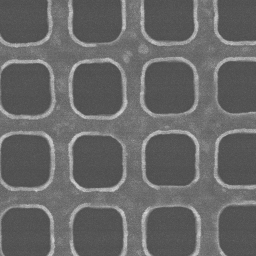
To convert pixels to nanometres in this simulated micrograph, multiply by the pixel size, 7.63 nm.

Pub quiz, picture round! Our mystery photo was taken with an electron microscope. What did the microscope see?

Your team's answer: holes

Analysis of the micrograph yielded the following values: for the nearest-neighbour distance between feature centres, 0.55 um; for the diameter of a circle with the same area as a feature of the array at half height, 0.425 um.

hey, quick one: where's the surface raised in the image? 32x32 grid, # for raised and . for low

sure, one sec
......###......###......###.....
......###......###......###.....
......###......###......###.....
......###......###......###.....
......###......####.....####....
################################
################################
################################
#.....####.....###......###.....
......###......###......###.....
......###......###......###.....
......###......###......###.....
......###......###......###.....
......###......###......####....
#############.##################
################################
################################
#.....###......####.....####....
......###......###......###.....
......###......###......###.....
......###......###.......##.....
......###......###.......##.....
......###......####.....####....
###.#######..###################
################################
################################
#.....####.....####.....####....
......###......###.......##.....
......###......###.......##.....
......###......###.......##.....
......###......###.......##.....
......####.....####.....####....